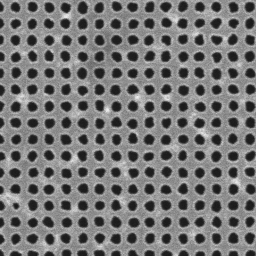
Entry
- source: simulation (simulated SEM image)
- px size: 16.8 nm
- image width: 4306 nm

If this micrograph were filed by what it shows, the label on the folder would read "a regular array of holes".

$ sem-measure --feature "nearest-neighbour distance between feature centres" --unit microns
0.268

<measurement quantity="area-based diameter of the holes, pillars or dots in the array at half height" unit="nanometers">182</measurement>